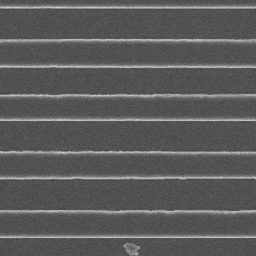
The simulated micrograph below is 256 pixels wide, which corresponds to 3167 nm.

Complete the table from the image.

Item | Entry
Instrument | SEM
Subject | lines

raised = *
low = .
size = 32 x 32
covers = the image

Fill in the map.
********************************
................................
................................
................................
................................
********************************
********************************
********************************
................................
................................
................................
................................
********************************
********************************
********************************
................................
................................
................................
................................
********************************
********************************
********************************
................................
................................
................................
................................
********************************
********************************
********************************
********************************
................................
................................